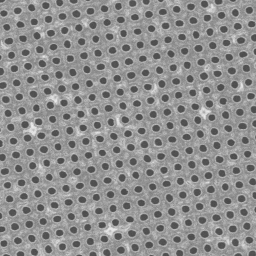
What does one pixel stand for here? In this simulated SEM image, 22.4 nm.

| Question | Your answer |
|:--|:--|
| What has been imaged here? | a regular array of holes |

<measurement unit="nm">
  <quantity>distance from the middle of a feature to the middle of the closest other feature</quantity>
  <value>312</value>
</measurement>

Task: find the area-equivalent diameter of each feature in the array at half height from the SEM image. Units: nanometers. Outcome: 166